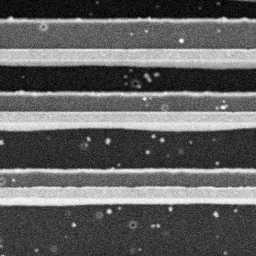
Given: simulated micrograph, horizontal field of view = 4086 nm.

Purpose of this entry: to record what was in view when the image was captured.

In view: lines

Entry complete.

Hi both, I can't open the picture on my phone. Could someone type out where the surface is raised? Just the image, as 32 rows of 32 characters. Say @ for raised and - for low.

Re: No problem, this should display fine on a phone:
--------------------------------
--------------------------------
-@-------@-------@@@-------@@-@-
@@@@@@@@@@@@@@@@@@@@@@@@@@@@@@@@
@@@@@@@@@@@@@@@@@@@@@@@@@@@@@@@@
@@@@@@@@@@@@@@@@@@@@@@@@@@@@@@@@
@@@@@@@@@@@@@@@@@@@@@@@@@@@@@@@@
@@@@@@@@@@@@@@@@@@@@@@@@@@@@@@@@
--------------------------------
--------------------------------
--------------------------------
--@-----------------------------
@@@@@@@@@@@@@@@@@@@@@@@@@@@@@@@@
@@@@@@@@@@@@@@@@@@@@@@@@@@@@@@@@
@@@@@@@@@@@@@@@@@@@@@@@@@@@@@@@@
@@@@@@@---------@@@@@@@@@@@@@@--
--------------------------------
--------------------------------
--------------------------------
--------------------------------
--------------------------------
@@@@@@@@@@@@@@@@@@@@@@@@@@@@@@@@
@@@@@@@@@@@@@@@@@@@@@@@@@@@@@@@@
@@@@@@@@@@@@@@@@@@@@@@@@@@@@@@@@
@@@@@@@@@@@@@@@@@@@@@@@@@@@@@@@@
--------------------------------
--------------------------------
--------------------------------
--------------------------------
--------------------------------
--------------------------------
--------------------------------